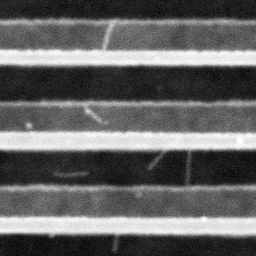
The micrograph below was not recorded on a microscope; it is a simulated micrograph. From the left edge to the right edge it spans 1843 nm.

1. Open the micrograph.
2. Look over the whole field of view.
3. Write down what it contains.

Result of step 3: lines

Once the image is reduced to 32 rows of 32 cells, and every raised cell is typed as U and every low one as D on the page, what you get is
DDDDDDDDDDDDDDDDDDDDDDDDDDDDDDDD
DDDDDDDDDDDDDDDDDDDDDDDDDDDDDDDD
DDDDDDDDDDDDDDDDDDDDDDDDDDDDDDDD
UUUUUUUUUUUUUUUUUUUUUUUUUUUUUUUU
UUUUUUUUUUUUUUUUUUUUUUUUUUUUUUUU
UUUUUUUUUUUUUUUUUUUUUUUUUUUUUUUU
UUUUUUUUUUUUUUUUUUUUUUUUUUUUUUUU
UUUUUUUUUUUUUUUUUUUUUUUUUUUUUUUU
DDDDDDDDDDDDDDDDDDDDDDDDDDDDDDDD
DDDDDDDDDDDDDDDDDDDDDDDDDDDDDDDD
DDDDDDDDDDDDDDDDDDDDDDDDDDDDDDDD
DDDDDDDDDDDDDDDDDDDDDDDDDDDDDDDD
DDDDDDDDDDDDDDDDDDDDDDDDDDDDDDDD
UUUUUUUUUUUUUUUUUUUUUUUUUUUUUUUU
UUUUUUUUUUUUUUUUUUUUUUUUUUUUUUUU
UUUUUUUUUUUUUUUUUUUUUUUUUUUUUUUU
UUUUUUUUUUUUUUUUUUUUUUUUUUUUUUUU
UUUUUUUUUUUUUUUUUUUUUUUUUUUUUUUU
UUDDDDDDDDUDDDDDDDDDUUDUDDDDDDDD
DDDDDDDDDDDDDDDDDDDDDDDDDDDDDDDD
DDDDDDDDDDDDDDDDDDDDDDDDDDDDDDDD
DDDDDDDDDDDDDDDDDDDDDDDDDDDDDDDD
DDDDDDDDDDDDDDDDDDDDDDDDDDDDDDDD
DDDDUUUDDDDDUUDDDUUUDDDDUUDUUUUU
UUUUUUUUUUUUUUUUUUUUUUUUUUUUUUUU
UUUUUUUUUUUUUUUUUUUUUUUUUUUUUUUU
UUUUUUUUUUUUUUUUUUUUUUUUUUUUUUUU
UUUUUUUUUUUUUUUUUUUUUUUUUUUUUUUU
UUUUUUUUUUUUUUUUUUUUUUUUUUUUUUUU
DDDDDDDDDDDDDDDDDDDDDDDDDDDDDDDD
DDDDDDDDDDDDDDDDDDDDDDDDDDDDDDDD
DDDDDDDDDDDDDDDDDDDDDDDDDDDDDDDD